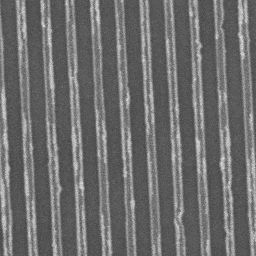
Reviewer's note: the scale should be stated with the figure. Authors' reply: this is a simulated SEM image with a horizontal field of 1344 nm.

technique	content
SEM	parallel lines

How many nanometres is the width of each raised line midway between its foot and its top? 42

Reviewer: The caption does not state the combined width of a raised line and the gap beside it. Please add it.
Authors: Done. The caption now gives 130 nm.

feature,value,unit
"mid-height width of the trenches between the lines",89.2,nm